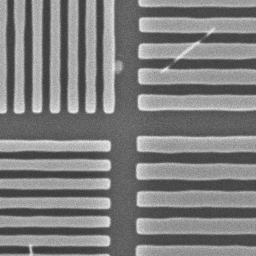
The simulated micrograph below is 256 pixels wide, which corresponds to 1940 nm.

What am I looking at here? groups of lines, slits or small figures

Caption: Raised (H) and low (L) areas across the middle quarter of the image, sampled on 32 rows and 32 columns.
LHHLLLHHLLHHLLLLLLLLLLLLLLLLLLLL
LHHLLLHHLLHHLLLLLLLHHHHHHHHLLLLL
LHHLLLHHLLHHLLLLLLLHHHHHHHHHHHHH
LHHLLLHHLLHHLLLLLLLHHHHHHHHHHHHH
LHHLLLHHLLHHLLLLLLLHHHHHHHHHHHHH
LHHLLLHHLLHHLLLLLLLLLLLLLLLLLLLL
LHHLLLHHLLHHLLLLLLLLLLLLLLLLLLLL
LHHLLLHHLLHHLLLLLLLLLLLLLLLLLLLL
LHHLLLHHLLHHLLLLLLLHHHHHHHHHHHHH
LHHLLLHHLLHHLLLLLLLHHHHHHHHHHHHH
LHHLLLHHLLHHLLLLLLLHHHHHHHHHHHHH
LHHLLLHHLLHHLLLLLLLLLLLLLLLLLLLL
LLLLLLLLLLLLLLLLLLLLLLLLLLLLLLLL
LLLLLLLLLLLLLLLLLLLLLLLLLLLLLLLL
LLLLLLLLLLLLLLLLLLLLLLLLLLLLLLLL
LLLLLLLLLLLLLLLLLLLLLLLLLLLLLLLL
LLLLLLLLLLLLLLLLLLLLLLLLLLLLLLLL
LLLLLLLLLLLLLLLLLLLLLLLLLLLLLLLL
LLLLLLLLLLLLLLLLLLLHHHHHHHHHHHHH
HHHHHHHHHHHLLLLLLLLHHHHHHHHHHHHH
HHHHHHHHHHHLLLLLLLLHHHHHHHHHHHHH
HHHHHHHHHHHLLLLLLLLHHHHHHHHHHHHH
LLLLLLLLLLLLLLLLLLLLLLLLLLLLLLLL
LLLLLLLLLLLLLLLLLLLLLLLLLLLLLLLL
HHHHHHHHHHHLLLLLLLLLLLLLLLLLLLLL
HHHHHHHHHHHLLLLLLLHHHHHHHHHHHHHH
HHHHHHHHHHHLLLLLLLHHHHHHHHHHHHHH
LLLLLLLLLLLLLLLLLLHHHHHHHHHHHHHH
LLLLLLLLLLLLLLLLLLLHHHHHHHHHHHHH
HHHHHHHHHHHLLLLLLLLLLLLLLLLLLLLL
HHHHHHHHHHHLLLLLLLLLLLLLLLLLLLLL
LLLLLLLLLLLLLLLLLLLLLLLLLLLLLLLL